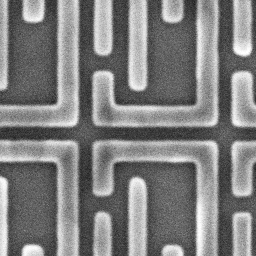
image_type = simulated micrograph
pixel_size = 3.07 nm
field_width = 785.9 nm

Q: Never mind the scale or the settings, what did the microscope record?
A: wiring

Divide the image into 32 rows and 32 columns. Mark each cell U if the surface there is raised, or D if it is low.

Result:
UDDUUDDUUUDDUUDDUUDDUUUDDUUDDUUD
UDDUUDDUUUDDUUDDUUDDUUUDDUUDDUUD
UDDUUDDUUUDDUUDDUUDDDUDDDUUDDUUD
UDDDDDDUUUDDUUDDUUDDDDDDDUUDDUUD
UDDDDDDUUUDDUUDDUUDDDDDDDUUDDUUD
UDDDDDDUUUDDUUDDUUDDDDDDDUUDDUUD
UDDDDDDUUUDDUUDDUUDDDDDDDUUDDDUD
UDDDDDDUUUDDDDDDUUDDDDDDDUUDDDDD
UDDDDDDUUUDDDDDDUUDDDDDDDUUDDDDD
UDDDDDDUUUDDUUDDUUDDDDDDDUUDDUUD
UDDDDDDUUUDDUUDDUUDDDDDDDUUDDUUD
DDDDDDDUUUDDUUDDDDDDDDDDDUUDDUUU
DDDDDDDUUUDDUUDDDDDDDDDDDUUDDUUU
UUUUUUUUUUDDUUUUUUUUUUUUUUUDDUUU
UUUUUUUUUUDDUUUUUUUUUUUUUUUDDUUU
UUUUUUUUUDDDUUUUUUUUUUUUUUUDDUUU
DDDDDDDDDDDDDDDDDDDDDDDDDDDDDDDD
DDDDDDDDDDDDDDDDDDDDDDDDDDDDDDDD
UUUUUUUUUUDDUUUUUUUUUUUUUUUDDUUU
UUUUUUUUUUDDUUUUUUUUUUUUUUUDDUUU
DDDDDDDUUUDDUUDDDDDDDDDDUUUDDUUU
DDDDDDDUUUDDUUDDDDDDDDDDDUUDDUUD
UDDDDDDUUUDDUUDDDUDDDDDDDUUDDUUD
UDDDDDDUUUDDUUDDUUDDDDDDDUUDDUUD
UDDDDDDUUUDDDDDDUUDDDDDDDUUDDDDD
UDDDDDDUUUDDDDDDUUDDDDDDDUUDDDDD
UDDDDDDUUUDDDDDDUUDDDDDDDUUDDDDD
UDDDDDDUUUDDUUDDUUDDDDDDDUUDDUUD
UDDDDDDUUUDDUUDDUUDDDDDDDUUDDUUD
UDDDDDDUUUDDUUDDUUDDDDDDDUUDDUUD
UDDDDDDUUUDDUUDDUUDDDDDDDUUDDUUD
UDDUUDDUUUDDUUDDUUDDUUUDDUUDDUUD